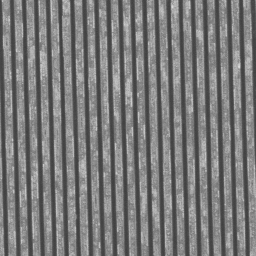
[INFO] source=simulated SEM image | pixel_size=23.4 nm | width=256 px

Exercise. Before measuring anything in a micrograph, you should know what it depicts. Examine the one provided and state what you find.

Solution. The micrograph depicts parallel lines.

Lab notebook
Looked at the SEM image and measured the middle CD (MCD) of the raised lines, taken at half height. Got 172 nanometres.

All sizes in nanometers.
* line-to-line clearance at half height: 108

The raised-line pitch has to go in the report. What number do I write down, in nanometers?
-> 282